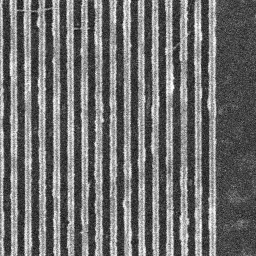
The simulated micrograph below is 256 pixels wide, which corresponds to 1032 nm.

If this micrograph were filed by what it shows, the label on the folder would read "parallel lines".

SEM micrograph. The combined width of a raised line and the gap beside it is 57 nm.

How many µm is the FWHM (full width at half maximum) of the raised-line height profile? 0.0247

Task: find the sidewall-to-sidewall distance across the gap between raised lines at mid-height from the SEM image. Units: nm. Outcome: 31.7